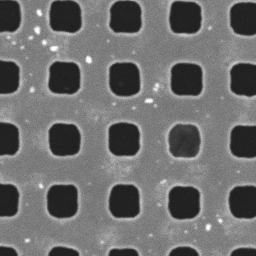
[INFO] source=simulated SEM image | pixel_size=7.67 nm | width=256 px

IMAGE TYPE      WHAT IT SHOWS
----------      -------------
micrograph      a regular array of holes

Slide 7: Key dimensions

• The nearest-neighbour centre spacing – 459 nm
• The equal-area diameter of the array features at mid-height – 34.9 pixels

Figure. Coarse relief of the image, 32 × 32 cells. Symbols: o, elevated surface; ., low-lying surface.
..oooo....oooo...ooooo...oooo...
...ooo....oooo....ooo....oooo...
...ooo....oooo....ooo....oooo...
..oooo....oooo....ooo....oooo...
oooooooooooooooooooooooooooooooo
oooooooooooooooooooooooooooooooo
oooooooooooooooooooooooooooooooo
oooooooooooooooooooooooooooooooo
..oooo....oooo...oooo....oooo...
...ooo....oooo...oooo....oooo...
..oooo....oooo....ooo....oooo...
..ooooo...oooo...ooooo...oooo...
oooooooooooooooooooooooooooooooo
oooooooooooooooooooooooooooooooo
oooooooooooooooooooooooooooooooo
.oooooo..ooooo...ooooo..oooooooo
..oooo....oooo...oooo....oooo...
..oooo....oooo...oooo....oooo...
..oooo....oooo...oooo....oooo...
ooooooo.ooooooo.oooooo..ooooo...
oooooooooooooooooooooooooooooooo
oooooooooooooooooooooooooooooooo
oooooooooooooooooooooooooooooooo
..oooo....oooo...ooooo..ooooo...
..oooo....oooo...oooo....oooo...
..oooo....oooo...oooo....oooo...
..oooo....oooo...oooo....oooo...
oooooooooooooooooooooooooooooooo
oooooooooooooooooooooooooooooooo
oooooooooooooooooooooooooooooooo
oooooooooooooooooooooooooooooooo
..oooo....oooo...oooo....oooo...